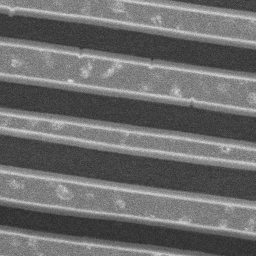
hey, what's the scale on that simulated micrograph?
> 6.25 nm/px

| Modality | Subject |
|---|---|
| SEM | one or a few lines or trenches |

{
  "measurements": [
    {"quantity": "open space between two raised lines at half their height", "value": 210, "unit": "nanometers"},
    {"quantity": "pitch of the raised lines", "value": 392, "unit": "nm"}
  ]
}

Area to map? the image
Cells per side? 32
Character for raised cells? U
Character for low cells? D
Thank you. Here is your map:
UUUUUUUUUUUUUUUUUUUUUDDDDDDDDDDD
DDDUUUUUUUUUUUUUUUUUUUUUUUUUDDDD
DDDDDDDDDDDUUUUUUUUUUUUUUUUUUUUU
DDDDDDDDDDDDDDDDDUUUUUUUUUUUUUUU
DDDDDDDDDDDDDDDDDDDDDDDDUUUUUUUU
UUUDDDDDDDDDDDDDDDDDDDDDDDDDDDDU
UUUUUUUUUUDDDDDDDDDDDDDDDDDDDDDD
UUUUUUUUUUUUUUUUDDDDDDDDDDDDDDDD
UUUUUUUUUUUUUUUUUUUUUUUDDDDDDDDD
UUUUUUUUUUUUUUUUUUUUUUUUUUUUUUDD
DDDDDDDUUUUUUUUUUUUUUUUUUUUUUUUU
DDDDDDDDDDDDDDUUUUUUUUUUUUUUUUUU
DDDDDDDDDDDDDDDDDDDDDUUUUUUUUUUU
DDDDDDDDDDDDDDDDDDDDDDDDDDDDUUUU
UUUUDDDDDDDDDDDDDDDDDDDDDDDDDDDD
UUUUUUUUUUUDDDDDDDDDDDDDDDDDDDDD
DUUUUUUUUUUUUUUUUUUDDDDDDDDDDDDD
DDDDDDDDUUUUUUUUUUUUUUUUUUDDDDDD
DDDDDDDDDDDDDDUUUUUUUUUUUUUUUUUU
DDDDDDDDDDDDDDDDDDDDDDUUUUUUUUUU
DDDDDDDDDDDDDDDDDDDDDDDDDDDDDUUU
UUDDDDDDDDDDDDDDDDDDDDDDDDDDDDDD
UUUUUUUUUDDDDDDDDDDDDDDDDDDDDDDD
UUUUUUUUUUUUUUUUDDDDDDDDDDDDDDDD
UUUUUUUUUUUUUUUUUUUUUUUDDDDDDDDD
DDUUUUUUUUUUUUUUUUUUUUUUUUUUUUUD
DDDDDDDDDUUUUUUUUUUUUUUUUUUUUUUU
DDDDDDDDDDDDDDDDDDUUUUUUUUUUUUUU
DDDDDDDDDDDDDDDDDDDDDDDDDUUUUUUU
UUUUUUDDDDDDDDDDDDDDDDDDDDDDDDDD
UUUUUUUUUUUUUDDDDDDDDDDDDDDDDDDD
UUUUUUUUUUUUUUUUUUUUUDDDDDDDDDDD